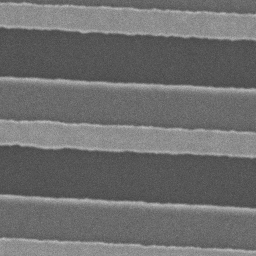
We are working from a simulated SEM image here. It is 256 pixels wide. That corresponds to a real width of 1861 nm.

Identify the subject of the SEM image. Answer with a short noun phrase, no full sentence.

lines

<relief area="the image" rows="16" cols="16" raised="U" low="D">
UUUUUUUUUUUUUUUU
UUUUUUUUUUUUUUUU
DDDDDDDDDDDDDDDD
DDDDDDDDDDDDDDDD
DDDDDDDDDDDDDDDD
UUUUUUUUUUUUUUDD
UUUUUUUUUUUUUUUU
UUUUUUUUUUUUUUUU
UUUUUUUUUUUUUUUU
DDDDDDDDDUUUUUUU
DDDDDDDDDDDDDDDD
DDDDDDDDDDDDDDDD
UUUUUUDDDDDDDDDD
UUUUUUUUUUUUUUUU
UUUUUUUUUUUUUUUU
UUUUUUUUUUUUUUUU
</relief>